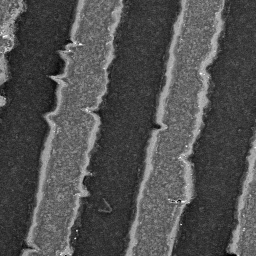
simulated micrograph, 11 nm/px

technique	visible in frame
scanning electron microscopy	one or a few lines or trenches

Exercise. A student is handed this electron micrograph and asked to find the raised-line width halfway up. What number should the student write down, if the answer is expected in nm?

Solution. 448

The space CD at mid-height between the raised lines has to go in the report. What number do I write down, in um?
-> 0.658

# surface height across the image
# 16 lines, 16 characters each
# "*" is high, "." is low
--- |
*....**....***..
*....**....***..
*...***....***..
....***....**...
....***....**...
....***...***...
....**....***...
...***....**....
...***....**....
...***...***....
...**....***....
..***....***...*
..***....***...*
..***....**....*
..**....***....*
..**....***....*